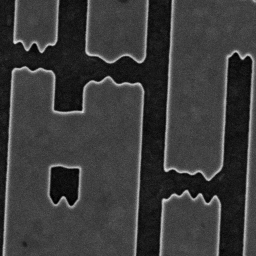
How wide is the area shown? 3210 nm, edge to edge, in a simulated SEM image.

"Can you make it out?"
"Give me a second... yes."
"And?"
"one or a few lines or trenches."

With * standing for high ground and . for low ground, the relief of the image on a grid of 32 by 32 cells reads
..*****....*******....**********
..*****....*******....**********
..*****....*******...***********
..*****....*******...***********
..*****....*******...***********
...****....*******...***********
...........*******...***********
.............**..*...********..*
.....................*******....
..*****..............*******....
.******....******....*******...*
.******...********...*******...*
.******...********...*******...*
.******...********...*******...*
.*****************...*******...*
.*****************...*******...*
.*****************...*******...*
.*****************...*******...*
.*****************...*******...*
.*****************...*******...*
.****************....*******...*
.*****....*******.....*****....*
.*****....*******..............*
.*****....*******..............*
.*****....*******....***.......*
.****************...*******....*
.****************...********...*
.****************...*******....*
.****************...*******....*
*****************...*******....*
*****************...*******....*
*****************...*******...**